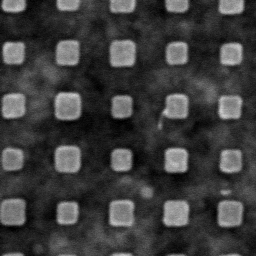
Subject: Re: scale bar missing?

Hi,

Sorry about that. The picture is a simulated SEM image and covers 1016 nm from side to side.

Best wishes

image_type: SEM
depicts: a regular array of raised bodies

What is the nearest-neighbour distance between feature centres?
0.211 µm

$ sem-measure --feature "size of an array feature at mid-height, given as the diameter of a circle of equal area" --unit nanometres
95.5